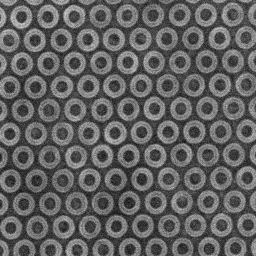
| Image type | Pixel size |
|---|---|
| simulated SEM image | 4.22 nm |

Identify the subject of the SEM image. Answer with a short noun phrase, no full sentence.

a regular array of ring-shaped raised bodies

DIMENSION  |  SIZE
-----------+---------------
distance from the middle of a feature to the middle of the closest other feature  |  110 nm